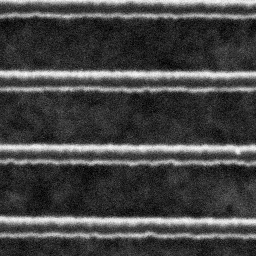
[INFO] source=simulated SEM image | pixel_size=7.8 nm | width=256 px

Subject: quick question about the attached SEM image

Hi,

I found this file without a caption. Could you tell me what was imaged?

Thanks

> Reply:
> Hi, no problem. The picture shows lines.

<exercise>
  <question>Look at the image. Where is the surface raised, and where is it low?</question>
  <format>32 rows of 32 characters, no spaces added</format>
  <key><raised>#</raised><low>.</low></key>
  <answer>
################################
################################
................................
................................
................................
................................
................................
................................
................................
################################
################################
................................
................................
................................
................................
................................
................................
................................
################################
################################
................#..............#
................................
................................
................................
................................
................................
................................
#####################..#........
################################
###.##..###.######.#############
................................
................................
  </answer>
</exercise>